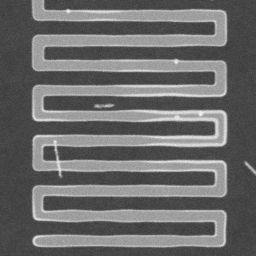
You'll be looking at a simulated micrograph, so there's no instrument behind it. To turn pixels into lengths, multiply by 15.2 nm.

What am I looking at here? groups of lines, slits or small figures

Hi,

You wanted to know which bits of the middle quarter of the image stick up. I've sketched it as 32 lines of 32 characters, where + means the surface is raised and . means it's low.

++++++++++++++++++++++++++++++++
+++....+++++++++++++++++++++++++
................................
................................
................................
..............................++
++++++++++++++++++++++++++++++++
++++++++++++++++++++++++++++++++
................................
................................
................................
................................
++++++++++++++++++++++++++++++++
++++++++++++++++++++++++++++++++
................................
................................
................................
................................
++++++++++++++++++++++++++++++++
++++++++++++++++++++++++++++++++
.++++++++.......................
................................
................................
................................
+++++++++++++++++++++++.++++++++
++++++++++++++++++++++++++++++++
++++++++++++++++++++++++++++++++
................................
................................
................................
...+++++++.....+++++++++........
++++++++++++++++++++++++++++++++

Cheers